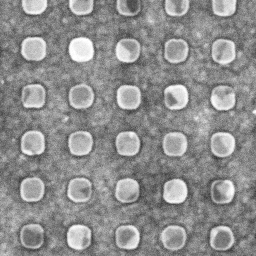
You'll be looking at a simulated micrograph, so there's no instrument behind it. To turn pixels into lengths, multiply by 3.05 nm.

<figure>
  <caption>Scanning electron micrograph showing a regular array of raised bodies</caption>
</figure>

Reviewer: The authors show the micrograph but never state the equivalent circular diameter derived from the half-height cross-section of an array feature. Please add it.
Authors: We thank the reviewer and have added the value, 0.0723 um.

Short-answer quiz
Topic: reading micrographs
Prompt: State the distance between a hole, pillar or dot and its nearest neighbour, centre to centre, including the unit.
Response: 142 nm